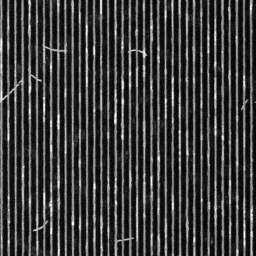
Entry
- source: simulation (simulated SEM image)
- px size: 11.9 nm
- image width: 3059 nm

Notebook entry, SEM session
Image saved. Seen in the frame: parallel lines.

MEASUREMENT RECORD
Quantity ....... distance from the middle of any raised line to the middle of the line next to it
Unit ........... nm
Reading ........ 85.3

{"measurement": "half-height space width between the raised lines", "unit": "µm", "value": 0.0628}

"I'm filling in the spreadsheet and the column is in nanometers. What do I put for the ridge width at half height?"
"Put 20.9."